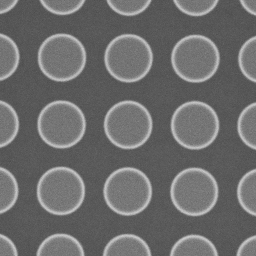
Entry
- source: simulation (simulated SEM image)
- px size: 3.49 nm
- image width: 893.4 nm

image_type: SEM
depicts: an array of small figures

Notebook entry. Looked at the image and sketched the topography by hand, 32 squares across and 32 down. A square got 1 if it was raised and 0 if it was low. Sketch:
11000111110000111110001111100011
10000011100000011100000111000001
00000000000000000000000000000000
00000000000000000000000000000000
10000011100000011000000010000000
11000111110000111100001111100001
11000111111001111110001111100011
11000111111001111110011111100011
11000111110001111110001111100011
10000011110000111100001111000001
00000000000000000000000000000000
00000000000000000000000000000000
00000000000000000000000000000000
11000011110000111100001111000001
11000111110001111110001111100011
11000111111001111110011111100011
11000111111001111110001111100011
11000111110000111100001111100011
00000000000000011000000110000000
00000000000000000000000000000000
00000000000000000000000000000000
10000011100000111100000111000001
11000111110001111110001111100011
11000111111001111110011111100011
11000111111001111110011111100011
11000111110001111100001111100011
10000011100000111000000111000001
00000000000000000000000000000000
00000000000000000000000000000000
10000011100000011000000110000000
11000111110001111100001111100011
11000111110001111110011111100011